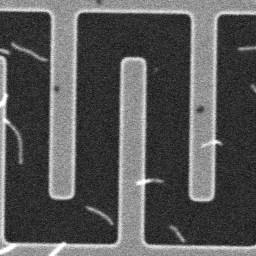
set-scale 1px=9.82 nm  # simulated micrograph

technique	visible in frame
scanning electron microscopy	groups of lines, slits or small figures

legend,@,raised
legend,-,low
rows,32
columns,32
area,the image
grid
@@@@@@@@@@@@@@@@@@@@@@@@@@@@@@@@
-----@@@@@@-@@@@@@@@@@@@@@@@@@@@
------@@@@--------------@@@-----
-------@@@--------------@@@-----
-------@@---------------@@@-----
------@@@---------------@@@-----
------@@@---------------@@@-----
@-----@@@------@@@------@@@-----
@-----@@@------@@@------@@@-----
@-----@@@------@@@------@@@-----
@-----@@@------@@@------@@@-----
@-----@@@------@@@------@@@-----
@-----@@@------@@@------@@@-----
@-----@@@------@@@------@@@-----
@-----@@@------@@@------@@@-----
@-----@@@------@@@------@@@-----
@-----@@@------@@@------@@@-----
@-----@@@------@@@------@@@-----
@-----@@@------@@@------@@@-----
@-----@@@------@@@------@@@-----
@-----@@@------@@@------@@@-----
@-----@@@------@@@------@@@-----
@-----@@@------@@@------@@@-----
------@@@------@@@------@@@-----
------@@@------@@@------@@@-----
---------------@@@--------------
---------------@@@--------------
---------------@@@--------------
---------------@@@--------------
---------------@@@--------------
@@@@@--@@-----@@@@--------------
@@@@@@@@@@@@@@@@@@@@@@@@@@@@@@@@